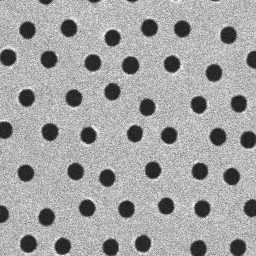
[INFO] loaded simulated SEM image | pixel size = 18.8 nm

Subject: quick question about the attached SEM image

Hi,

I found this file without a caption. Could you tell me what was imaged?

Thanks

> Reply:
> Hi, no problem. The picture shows a regular array of holes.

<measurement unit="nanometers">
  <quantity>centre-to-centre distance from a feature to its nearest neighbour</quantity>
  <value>670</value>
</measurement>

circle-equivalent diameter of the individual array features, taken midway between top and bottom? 0.326 um